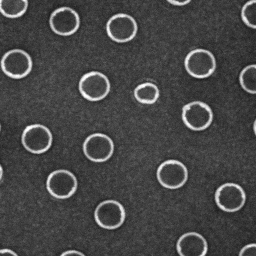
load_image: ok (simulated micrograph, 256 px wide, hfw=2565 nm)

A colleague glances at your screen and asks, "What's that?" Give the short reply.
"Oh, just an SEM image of a regular array of raised bodies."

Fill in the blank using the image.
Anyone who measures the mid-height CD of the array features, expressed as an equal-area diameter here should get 281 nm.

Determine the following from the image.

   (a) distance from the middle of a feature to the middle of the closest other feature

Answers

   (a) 528 nanometres